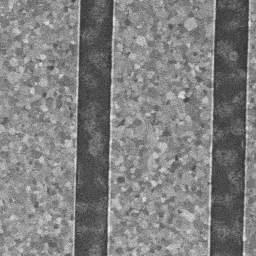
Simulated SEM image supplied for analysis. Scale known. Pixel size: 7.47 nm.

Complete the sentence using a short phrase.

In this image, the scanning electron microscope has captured one or a few lines or trenches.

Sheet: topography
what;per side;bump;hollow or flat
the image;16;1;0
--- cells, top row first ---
1111100111111000
1111100111111000
1111100111111000
1111100111111000
1111100111111001
1111100111111001
1111100111111001
1111100111111001
1111100111111001
1111100111111001
1111100111111001
1111100111111001
1111100111111001
1111100111111001
1111100111111001
1111100111111001